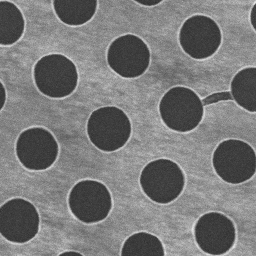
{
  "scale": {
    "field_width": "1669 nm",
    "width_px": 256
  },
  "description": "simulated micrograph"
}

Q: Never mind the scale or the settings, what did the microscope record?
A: holes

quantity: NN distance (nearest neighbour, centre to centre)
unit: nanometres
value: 488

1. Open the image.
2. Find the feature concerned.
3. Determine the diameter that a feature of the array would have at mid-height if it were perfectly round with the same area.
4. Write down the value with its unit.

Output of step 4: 43.4 px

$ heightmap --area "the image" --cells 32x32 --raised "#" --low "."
..#####.....######..############
...####.....###################.
...#####...############....####.
...####################....#####
...############..#####......####
.#############....#####....#####
#############......####....#####
#####....####......#############
####......####....#############.
####......#####..############...
####......###################...
.####....############...####....
.###################............
#############..#####......####..
###########.....####.....#######
###########.....#####....#######
###...#####.....################
##.....####.....############..##
##.....#####...############.....
##.....####################.....
###....###########....#####.....
##################.....####.....
#################......#####...#
#########....#####.....#########
#########.....####....##########
#...#####.....##################
.....####.....##################
.....#####...############....###
.....###################.....###
....############...#####.....###
###############.....#####....###
########..#####......#####..####